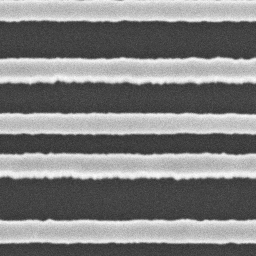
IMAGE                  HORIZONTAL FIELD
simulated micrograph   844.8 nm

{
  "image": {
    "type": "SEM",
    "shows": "lines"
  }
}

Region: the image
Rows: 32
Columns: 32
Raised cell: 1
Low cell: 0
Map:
11111111111111111111111111111111
11111111111111111111111111111111
11111111111111111111111111111111
00000000000000000000000000000000
00000000000000000000000000000000
00000000000000000000000000000000
00000000000000000000000000000000
11111111111111111111111111111111
11111111111111111111111111111111
11111111111111111111111111111111
00000000000000000000000000000000
00000000000000000000000000000000
00000000000000000000000000000000
00000000000000000000000000000000
11111111111111111111111111111111
11111111111111111111111111111111
11111111111111111111111111111111
00000000000000000000000000000000
00000000000000000000000000000000
11111111111111111111111111111111
11111111111111111111111111111111
11111111111111111111111111111111
00000000000000000000000000000000
00000000000000000000000000000000
00000000000000000000000000000000
00000000000000000000000000000000
00000000000000000000000000000000
00000000000000000000001100000000
11111111111111111111111111111111
11111111111111111111111111111111
00000000000000000000000000000000
00000000000000000000000000000000